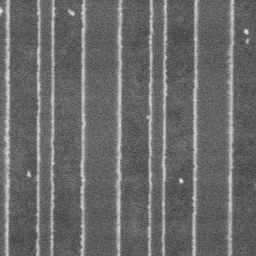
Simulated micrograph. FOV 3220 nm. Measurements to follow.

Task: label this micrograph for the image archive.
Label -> lines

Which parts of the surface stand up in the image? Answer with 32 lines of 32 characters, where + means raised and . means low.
+....++...+++++....++...+++++...
+....++...+++++....++....++++...
+....++...+++++....++...+++++...
+....++...+++++....++...+++++...
+....++...+++++....++...+++++...
+....++...+++++....++...+++++...
+....++...+++++....++...+++++...
+....++...+++++....++...+++++...
+....++...+++++....++...+++++...
+....++...+++++....++...+++++...
+....++...+++++....++...+++++...
+....++...+++++....++...+++++...
+....++...+++++....++...+++++...
+....++...+++++....++...+++++...
+....++...+++++....++...+++++...
+....++...+++++....++...+++++...
+....++...+++++....++...+++++...
+....++...+++++....++...+++++...
+....++...+++++....++...+++++...
+....++...+++++....+....+++++...
+....++...+++++....+....+++++...
+....++...+++++....++...+++++...
+....++...+++++....++...+++++...
+....++...+++++....+....+++++...
+....++...+++++....+....+++++...
+....++...+++++....+....+++++...
+....++...+++++....+....+++++...
+....++...+++++....+....+++++...
+....++...+++++....+....+++++...
+....++...+++++....+....+++++...
+....++...+++++....+....+++++...
+....++...+++++....+....+++++...